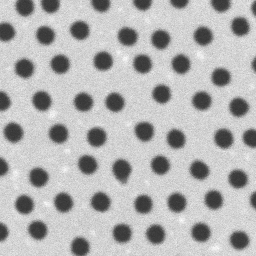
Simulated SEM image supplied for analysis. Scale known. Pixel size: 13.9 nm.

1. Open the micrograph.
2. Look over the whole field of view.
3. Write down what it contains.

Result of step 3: a regular array of holes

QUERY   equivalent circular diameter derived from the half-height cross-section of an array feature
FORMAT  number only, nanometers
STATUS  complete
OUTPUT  272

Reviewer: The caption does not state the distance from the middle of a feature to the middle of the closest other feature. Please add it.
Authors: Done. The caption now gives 458 nanometres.